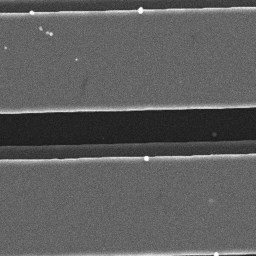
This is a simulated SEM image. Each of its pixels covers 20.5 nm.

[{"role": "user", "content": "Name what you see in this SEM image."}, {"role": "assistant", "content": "lines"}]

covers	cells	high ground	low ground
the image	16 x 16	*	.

****************
****************
****************
****************
****************
****************
****************
................
................
****************
****************
****************
****************
****************
****************
****************